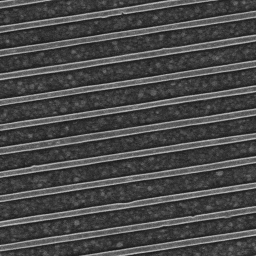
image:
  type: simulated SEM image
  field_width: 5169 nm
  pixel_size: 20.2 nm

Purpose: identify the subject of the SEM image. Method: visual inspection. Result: parallel lines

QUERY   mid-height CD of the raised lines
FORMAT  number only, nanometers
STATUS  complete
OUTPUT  112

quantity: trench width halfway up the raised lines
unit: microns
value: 0.357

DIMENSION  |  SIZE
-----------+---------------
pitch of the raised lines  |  484 nm